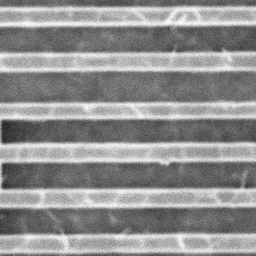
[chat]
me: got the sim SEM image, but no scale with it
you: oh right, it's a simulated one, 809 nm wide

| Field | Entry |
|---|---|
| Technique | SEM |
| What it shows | parallel lines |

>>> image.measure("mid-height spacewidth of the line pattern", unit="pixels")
29.4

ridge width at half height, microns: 0.0522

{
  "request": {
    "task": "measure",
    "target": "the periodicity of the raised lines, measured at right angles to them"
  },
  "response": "144 nanometers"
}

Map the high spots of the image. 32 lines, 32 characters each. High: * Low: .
................................
********************************
********************************
................................
................................
................................
................................
********************************
********************************
................................
................................
................................
................................
********************************
********************************
................................
................................
................................
********************************
********************************
................................
................................
................................
................................
********************************
********************************
................................
................................
................................
..**...*....****......**********
********************************
***********.....................